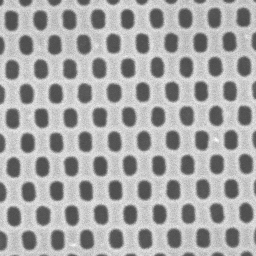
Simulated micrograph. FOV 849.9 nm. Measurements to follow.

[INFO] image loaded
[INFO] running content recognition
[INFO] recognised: a regular array of holes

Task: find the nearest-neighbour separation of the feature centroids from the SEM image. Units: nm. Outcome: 93.6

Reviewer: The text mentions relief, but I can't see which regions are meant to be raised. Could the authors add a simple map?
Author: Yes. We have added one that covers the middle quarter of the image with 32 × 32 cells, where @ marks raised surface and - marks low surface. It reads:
---@@@@----@@@----@@@@---@@@@---
---@@@@----@@@----@@@@---@@@@---
---@@@@----@@@----@@@@---@@@@---
@--@@@@@-@@@@@@@@@@@@@@@@@@@@@@@
@@@@@@@@@@@@@@@@@@@@@@@@@@@@@@@@
@@@@---@@@@---@@@@---@@@@----@@@
@@@----@@@@---@@@@----@@@----@@@
@@@----@@@@---@@@@----@@@----@@@
@@@@---@@@@---@@@@---@@@@@---@@@
@@@@--@@@@@@-@@@@@@@@@@@@@@-@@@@
@@@@@@@@@@@@@@@@@@@@@@@@@@@@@@-@
---@@@@---@@@@@--@@@@@---@@@@---
---@@@@----@@@----@@@@---@@@@---
---@@@@----@@@----@@@@---@@@@---
---@@@@----@@@@---@@@@---@@@@---
---@@@@@--@@@@@@-@@@@@@-@@@@@@-@
@@@@@@@@@@@@@@@@@@@@@@@@@@@@@@@@
@@@@---@@@@---@@@@---@@@@@---@@@
@@@----@@@@---@@@@----@@@----@@@
@@@----@@@@----@@@----@@@@---@@@
@@@@---@@@@----@@@----@@@@---@@@
@@@@---@@@@@--@@@@@--@@@@@@-@@@@
@@@@@@@@@@@@@@@@@@@@@@@@@@@@@@@@
@--@@@@@--@@@@@---@@@@---@@@@---
----@@@----@@@@---@@@@---@@@@---
----@@@----@@@@---@@@@---@@@@---
----@@@----@@@@---@@@@---@@@@---
@--@@@@@--@@@@@--@@@@@@--@@@@@--
@@@@@@@@@@@@@@@@@@@@@@@@@@@@@@@@
@@@@--@@@@@@--@@@@@--@@@@@---@@@
@@@@---@@@@---@@@@----@@@@---@@@
@@@@---@@@@----@@@----@@@@---@@@